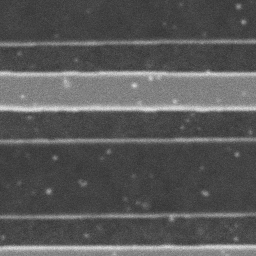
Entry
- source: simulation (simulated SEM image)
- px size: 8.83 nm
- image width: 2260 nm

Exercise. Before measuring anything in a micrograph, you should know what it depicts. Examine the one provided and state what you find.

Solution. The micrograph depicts lines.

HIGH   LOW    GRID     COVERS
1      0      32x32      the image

11111111111111111111111111111111
11111111111111111111111111111111
11111111111111111111111111111111
11111111111111111111111111111111
11111111111111111111111111111111
11111111111000000000000000000000
00000000000000000000000000000000
00000000000000000000000000000000
00000000000000000000000000000000
11111111111111111111111111111111
11111111111111111111111111111111
11111111111111111111111111111111
11111111111111111111111111111111
11111111111111111111111111111111
00000000000000000000000000000000
00000000000000000000000000000000
00000000000000000000000000000000
00000000001011111111111111111111
11111111111111111111111111111111
11111111111111111111111111111111
11111111111111111111111111111111
11111111111111111111111111111111
11111111111111111111111111111111
11111111111111111111111111111111
11111111111111111111111111111111
11111111111111111111111111111111
11111111111111111111111111111111
00000000000000000000000000000000
00000000000000000000000000000000
00000000000000000000000000000000
00000000000000000000000000000000
11111111111111111111111111111111